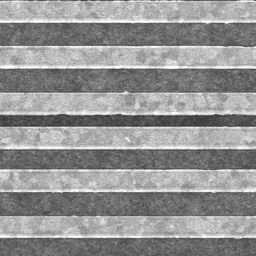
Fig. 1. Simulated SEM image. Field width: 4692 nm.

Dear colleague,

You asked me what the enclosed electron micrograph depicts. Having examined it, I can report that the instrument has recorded lines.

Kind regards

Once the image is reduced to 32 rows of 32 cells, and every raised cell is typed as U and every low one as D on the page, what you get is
UUUUUUUUUUUUUUUUUUUUUUUUUUUUUUUU
UUUUUUUUUUUUUUUUUUUUUUUUUUUUUUUU
UUUUUUUUUUUUUUUUUUUUUUUUUUUUUUUU
DDDDDDDDDDDDDDDDDDDDDDDDDDDDDDDD
DDDDDDDDDDDDDDDDDDDDDDDDDDDDDDDD
DDDDDDDDDDDDDDDDDDDDDDDDDDDDDDDD
UUUUUUUUUUUUUUUUUUUUUUUUUUUUUUUU
UUUUUUUUUUUUUUUUUUUUUUUUUUUUUUUU
DDDDDDDDDDDDDDDDDDDDDDDDDDDDDDDD
DDDDDDDDDDDDDDDDDDDDDDDDDDDDDDDD
DDDDDDDDDDDDDDDDDDDDDDDDDDDDDDDD
DDDDDDDDDDDDDDDDDDDDDDDDDDDDDDDD
UUUUUUUUUUUUUUUUUUUUUUUUUUUUUUUU
UUUUUUUUUUUUUUUUUUUUUUUUUUUUUUUU
DDDDDDDDDDDDDDDDDDDDDDDDDDDDDDDD
DDDDDDDDDDDDDDDDDDDDDDDDDDDDDDDD
UUUUUUUUUUUUUUUUUUUUUUUUUUUUUUUU
UUUUUUUUUUUUUUUUUUUUUUUUUUUUUUUU
UUUUUUUUUUUUUUUUUUUUUUUUUUUUUUUU
DDDDDDDDDDDDDDDDDDDDDDDDDDDDDDDD
DDDDDDDDDDDDDDDDDDDDDDDDDDDDDDDD
UUUUUUUUUUUUUUUUUUUUUUUUUUUUUUUU
UUUUUUUUUUUUUUUUUUUUUUUUUUUUUUUU
UUUUUUUUUUUUUUUUUUUUUUUUUUUUUUUU
DDDDDDDDDDDDDDDDDDDDDDDDDDDDDDDD
DDDDDDDDDDDDDDDDDDDDDDDDDDDDDDDD
DDDDDDDDDDDDDDDDDDDDDDDDDDDDDDDD
UUUUUUUUUUUUUUUUUUUUUUUUUUUUUUUU
UUUUUUUUUUUUUUUUUUUUUUUUUUUUUUUU
UUUUUUUUUUUUUUUUUUUUUUUUUUUUUUUU
DDDDDDDDDDDDDDDDDDDDDDDDDDDDDDDD
DDDDDDDDDDDDDDDDDDDDDDDDDDDDDDDD